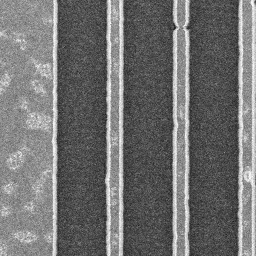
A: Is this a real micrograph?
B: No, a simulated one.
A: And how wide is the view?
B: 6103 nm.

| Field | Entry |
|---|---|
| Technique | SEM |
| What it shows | one or a few lines or trenches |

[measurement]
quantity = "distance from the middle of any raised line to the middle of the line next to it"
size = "1580 nm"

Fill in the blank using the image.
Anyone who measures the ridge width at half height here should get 316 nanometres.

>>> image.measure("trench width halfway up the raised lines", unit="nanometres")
1270